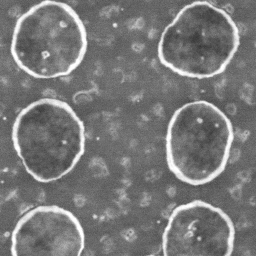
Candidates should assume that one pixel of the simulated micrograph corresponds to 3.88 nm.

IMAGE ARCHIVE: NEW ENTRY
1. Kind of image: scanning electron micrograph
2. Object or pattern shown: raised bodies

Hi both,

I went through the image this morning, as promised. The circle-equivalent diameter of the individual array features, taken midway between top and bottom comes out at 284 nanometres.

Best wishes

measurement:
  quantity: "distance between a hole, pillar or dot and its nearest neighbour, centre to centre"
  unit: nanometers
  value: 388